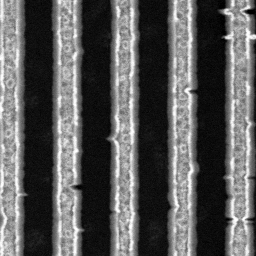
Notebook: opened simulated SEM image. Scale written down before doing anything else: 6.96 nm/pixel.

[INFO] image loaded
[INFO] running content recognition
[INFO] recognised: parallel lines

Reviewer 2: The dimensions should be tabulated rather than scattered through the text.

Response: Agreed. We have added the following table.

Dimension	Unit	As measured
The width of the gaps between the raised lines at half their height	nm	249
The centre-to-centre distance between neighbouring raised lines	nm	401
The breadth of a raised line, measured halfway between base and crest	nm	153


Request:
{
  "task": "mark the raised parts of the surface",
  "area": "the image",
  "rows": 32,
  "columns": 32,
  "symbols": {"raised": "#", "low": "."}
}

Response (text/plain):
###....###....###.....##.....##.
###....###....###....###....###.
###....###....###....###.....##.
###....###....###....###.....##.
###....###....###....###....####
###....###....###....###.....##.
###....###....###....###.....##.
###....###....###....###.....##.
###....###....###....###.....##.
###....###....###....###.....##.
###....###....###....###.....##.
###....###....###....###.....##.
###....###....###....###.....##.
###....###....###....###.....##.
###....###....###....###.....##.
###....###....###....###.....##.
###....###....###....###.....##.
###....###....###....###.....##.
###....###....###.....##.....###
###....###....###....###.....##.
###....###....###....###.....##.
##.....###....###....###.....##.
##.....###....###....###.....##.
##.....##.....###....###.....##.
###....###....###....###.....##.
##.....###....###.....##.....##.
###....###....###....###.....##.
###....###....###....###.....##.
##.....###....###....###.....##.
###....###....###....###.....##.
##.....###....###....###.....##.
##.....###....###....###.....##.